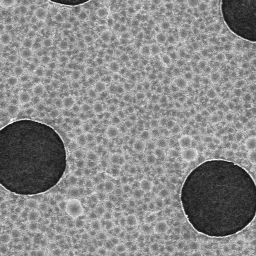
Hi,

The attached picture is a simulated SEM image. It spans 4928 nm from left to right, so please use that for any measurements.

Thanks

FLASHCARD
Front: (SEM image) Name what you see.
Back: holes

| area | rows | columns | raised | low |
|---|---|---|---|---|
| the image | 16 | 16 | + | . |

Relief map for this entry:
++++++++++++++..
++++++++++++++..
++++++++++++++++
++++++++++++++++
++++++++++++++++
++++++++++++++++
++++++++++++++++
++++++++++++++++
....++++++++++++
....++++++++++++
....++++++++...+
...++++++++.....
+++++++++++.....
++++++++++++....
+++++++++++++..+
++++++++++++++++